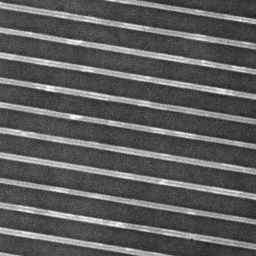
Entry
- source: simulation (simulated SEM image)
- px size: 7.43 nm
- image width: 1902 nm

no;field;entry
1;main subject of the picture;parallel lines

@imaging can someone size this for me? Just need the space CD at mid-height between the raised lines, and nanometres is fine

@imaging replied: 150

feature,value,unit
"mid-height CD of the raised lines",35.7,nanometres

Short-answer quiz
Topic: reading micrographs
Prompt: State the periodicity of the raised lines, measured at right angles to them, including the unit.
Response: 0.184 micrometres